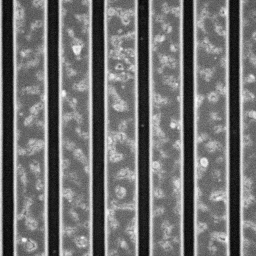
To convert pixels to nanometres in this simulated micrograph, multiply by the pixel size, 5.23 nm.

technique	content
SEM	parallel lines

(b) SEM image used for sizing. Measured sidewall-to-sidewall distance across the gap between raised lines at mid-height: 65.4 nm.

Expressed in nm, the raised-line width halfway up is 170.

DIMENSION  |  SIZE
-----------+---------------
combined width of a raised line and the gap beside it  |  237 nm